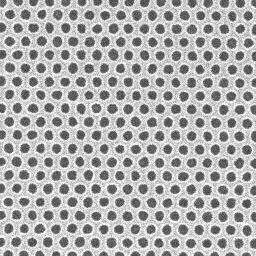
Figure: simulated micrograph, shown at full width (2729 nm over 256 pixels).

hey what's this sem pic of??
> a regular array of holes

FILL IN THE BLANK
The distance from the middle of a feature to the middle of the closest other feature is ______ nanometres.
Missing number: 162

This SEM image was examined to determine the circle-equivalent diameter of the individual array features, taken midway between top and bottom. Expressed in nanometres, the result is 110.